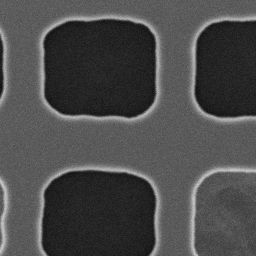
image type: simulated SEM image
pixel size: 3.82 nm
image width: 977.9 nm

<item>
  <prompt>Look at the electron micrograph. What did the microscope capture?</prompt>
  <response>holes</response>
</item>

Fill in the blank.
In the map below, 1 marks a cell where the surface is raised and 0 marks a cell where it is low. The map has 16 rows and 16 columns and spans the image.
1111111111111111
1111000001111000
1110000000110000
1110000000110000
1110000000110000
1110000000110000
1110000000110000
1111111111111111
1111111111111111
1111111111111111
1111111111111111
1110000001111000
1110000000110000
1110000000110000
1110000000110000
1110000000110000